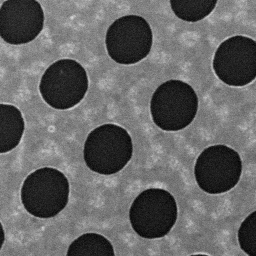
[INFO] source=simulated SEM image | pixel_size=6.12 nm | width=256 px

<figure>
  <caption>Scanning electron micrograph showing holes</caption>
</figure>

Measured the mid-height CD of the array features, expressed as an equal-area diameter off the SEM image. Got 0.307 um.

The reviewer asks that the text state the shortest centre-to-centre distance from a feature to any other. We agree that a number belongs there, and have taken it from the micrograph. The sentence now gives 475 nm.